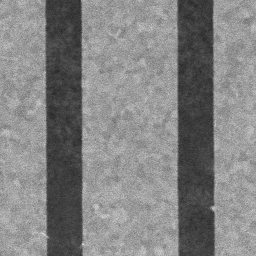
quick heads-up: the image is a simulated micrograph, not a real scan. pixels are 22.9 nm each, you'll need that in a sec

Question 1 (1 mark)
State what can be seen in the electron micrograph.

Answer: one or a few lines or trenches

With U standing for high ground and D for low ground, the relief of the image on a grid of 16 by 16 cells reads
UUUDDUUUUUUDDUUU
UUUDDUUUUUUDDUUU
UUUDDUUUUUUDDUUU
UUUDDUUUUUUDDUUU
UUUDDUUUUUUDDUUU
UUUDDUUUUUUDDUUU
UUUDDUUUUUUDDUUU
UUUDDUUUUUUDDUUU
UUUDDUUUUUUDDUUU
UUUDDUUUUUUDDUUU
UUUDDUUUUUUDDUUU
UUUDDUUUUUUDDUUU
UUUDDUUUUUUDDUUU
UUUDDUUUUUUDDUUU
UUUDDUUUUUUDDUUU
UUUDDUUUUUUDDUUU